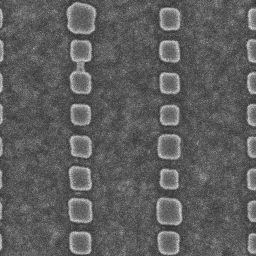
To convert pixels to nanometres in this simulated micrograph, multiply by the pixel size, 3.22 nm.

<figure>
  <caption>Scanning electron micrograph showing a regular array of raised bodies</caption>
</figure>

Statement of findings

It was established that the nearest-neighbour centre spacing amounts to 102 nm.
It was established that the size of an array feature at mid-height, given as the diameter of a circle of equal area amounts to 72.6 nanometers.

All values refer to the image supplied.